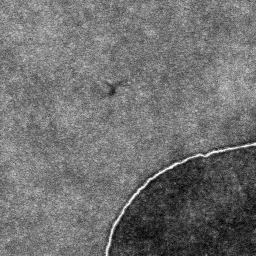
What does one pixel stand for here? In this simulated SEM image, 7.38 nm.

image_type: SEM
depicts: one or a few lines or trenches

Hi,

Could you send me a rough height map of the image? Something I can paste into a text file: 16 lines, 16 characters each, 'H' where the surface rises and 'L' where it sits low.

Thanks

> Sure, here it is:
LLLLLLLLLLLLLLLL
LLLLLLLLLLLLLLLL
LLLLLLLLLLLLLLLL
LLLLLLLLLLLLLLLL
LLLLLLLLLLLLLLLL
LLLLLLLLLLLLLLLL
LLLLLLLLLLLLLLLL
LLLLLLLLLLLLLLLL
LLLLLLLLLLLLLLLL
LLLLLLLLLLLLLHHH
LLLLLLLLLLLHHHHH
LLLLLLLLLHHHHHHH
LLLLLLLLHHHHHHHH
LLLLLLLLHHHHHHHH
LLLLLLLHHHHHHHHH
LLLLLLLHHHHHHHHH